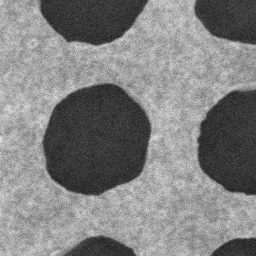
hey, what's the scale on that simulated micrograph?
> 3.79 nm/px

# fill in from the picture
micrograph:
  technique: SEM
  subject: holes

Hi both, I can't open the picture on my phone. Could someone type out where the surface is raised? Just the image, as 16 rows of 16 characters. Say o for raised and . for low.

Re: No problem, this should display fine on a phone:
oo.......ooo....
ooo.....ooooo...
oooo...ooooooo..
oooooooooooooooo
oooooooooooooooo
ooooo...ooooooo.
oooo.....oooo...
ooo......oooo...
ooo......ooo....
ooo......ooo....
ooo......oooo...
oooo....oooooo..
oooooooooooooooo
oooooooooooooooo
oooooooooooooooo
oooo....oooooo..